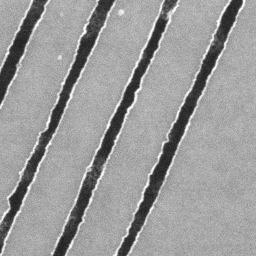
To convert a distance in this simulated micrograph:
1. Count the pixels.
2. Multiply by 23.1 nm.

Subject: parallel lines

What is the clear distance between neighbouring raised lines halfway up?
1.06 microns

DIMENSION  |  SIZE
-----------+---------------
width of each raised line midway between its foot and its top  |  317 nanometres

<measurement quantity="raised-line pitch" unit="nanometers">1370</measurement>